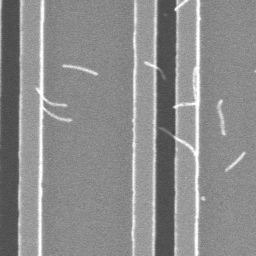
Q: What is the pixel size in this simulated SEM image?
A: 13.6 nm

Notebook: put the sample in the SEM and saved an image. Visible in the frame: lines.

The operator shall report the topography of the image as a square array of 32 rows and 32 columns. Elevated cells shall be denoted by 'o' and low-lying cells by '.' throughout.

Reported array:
...oo............ooo..ooo.......
...oo............ooo..ooo.......
...oo............ooo..ooo.......
...oo............oo...ooo.......
...oo............ooo..ooo.......
...oo............oo...ooo.......
...oo............oo...ooo.......
..ooo............oo...ooo.......
...oo............ooo..ooo.......
...oo............oo...ooo.......
...oo............oo...ooo.......
..ooo............oo...ooo.......
..ooo............oo...ooo.......
..ooo............oo...ooo.......
..ooo............oo...ooo.......
..ooo............oo...ooo.......
..ooo............oo...ooo.......
..ooo............oo...ooo.......
..ooo............oo...ooo.......
..ooo............oo...ooo.......
..ooo............oo...ooo.......
..ooo............oo...ooo.......
..ooo............oo...ooo.......
..ooo............oo...ooo.......
..ooo............oo...ooo.......
..ooo............oo...ooo.......
..ooo............oo...ooo.......
..ooo............oo...ooo.......
..ooo............oo...ooo.......
..ooo............oo...ooo.......
..ooo............oo...ooo.......
..ooo............oo...ooo.......